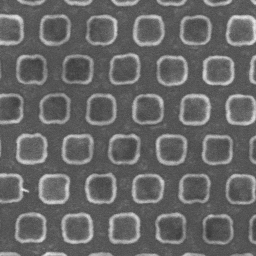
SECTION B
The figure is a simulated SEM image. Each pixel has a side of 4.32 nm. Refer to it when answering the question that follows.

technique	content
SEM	a regular array of raised bodies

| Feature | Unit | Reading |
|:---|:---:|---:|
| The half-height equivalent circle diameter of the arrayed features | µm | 0.134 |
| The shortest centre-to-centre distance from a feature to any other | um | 0.197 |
